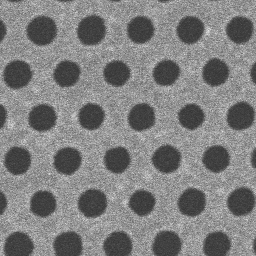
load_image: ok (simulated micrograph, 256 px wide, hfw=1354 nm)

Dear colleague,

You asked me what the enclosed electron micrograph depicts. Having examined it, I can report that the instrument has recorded a regular array of holes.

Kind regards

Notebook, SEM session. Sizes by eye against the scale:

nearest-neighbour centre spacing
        260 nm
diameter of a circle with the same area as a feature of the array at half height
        0.149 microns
